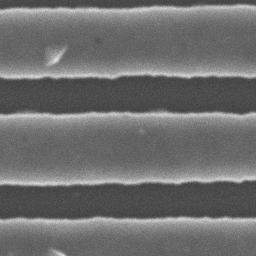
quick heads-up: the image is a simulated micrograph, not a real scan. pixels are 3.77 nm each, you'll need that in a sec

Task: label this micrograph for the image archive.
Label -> lines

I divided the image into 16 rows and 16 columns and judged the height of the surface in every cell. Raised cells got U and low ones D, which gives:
DDDDDDDDDUUDUUUU
UUUUUUUUUUUUUUUU
UUUUUUUUUUUUUUUU
UUUUUUUUUUUUUUUU
UUUUUUUUUUUUUUUU
DDDDDDDDDDDDDDDD
DDDDDDDDDDDDDDDD
UUUUUUUUUUUUUUUU
UUUUUUUUUUUUUUUU
UUUUUUUUUUUUUUUU
UUUUUUUUUUUUUUUU
UUUUUUDDDDDDDDDD
DDDDDDDDDDDDDDDD
DDDDDDDDDDDDDDDD
UUUUUUUUUUUUUUUU
UUUUUUUUUUUUUUUU